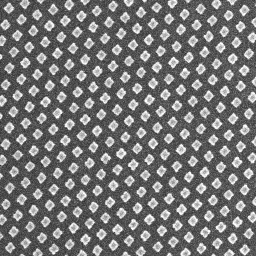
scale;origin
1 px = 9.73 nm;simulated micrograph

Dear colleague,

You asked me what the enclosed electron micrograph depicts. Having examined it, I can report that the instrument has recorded a regular array of raised bodies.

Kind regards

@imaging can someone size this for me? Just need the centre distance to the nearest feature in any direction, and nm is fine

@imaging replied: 157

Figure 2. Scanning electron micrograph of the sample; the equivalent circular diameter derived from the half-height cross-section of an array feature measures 0.0807 micrometres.